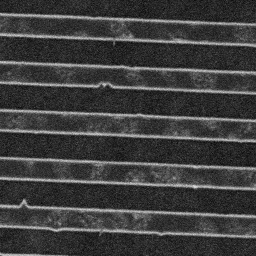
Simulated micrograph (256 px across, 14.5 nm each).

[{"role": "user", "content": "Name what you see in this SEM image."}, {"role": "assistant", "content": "parallel lines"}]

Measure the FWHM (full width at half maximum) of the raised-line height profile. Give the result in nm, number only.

304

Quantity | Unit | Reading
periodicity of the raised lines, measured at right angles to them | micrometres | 0.693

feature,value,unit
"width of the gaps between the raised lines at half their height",26.2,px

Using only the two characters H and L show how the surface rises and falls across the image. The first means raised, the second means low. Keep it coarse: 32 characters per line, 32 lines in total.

LLLLLLLLLLLLLLLLLLLLLLLLLLLLLLLL
LLLLLLLLLLLLLLLLLLLLLLLLLLLLLLLL
HHHHHHHHHHHHHHHHHLLLLLLLLLLLLLLL
HHHHHHHHHHHHHHHHHHHHHHHHHHHHHHHH
LLLLHHHHHHHHHHHHHHHHHHHHHHHHHHHH
LLLLLLLLLLLLLLLLLLLLLLLLLLLLHHHH
LLLLLLLLLLLLLLLLLLLLLLLLLLLLLLLL
LLLLLLLLLLLLLLLLLLLLLLLLLLLLLLLL
HHHHHHHHHHHHHHHHLLLLLLLLLLLLLLLL
HHHHHHHHHHHHHHHHHHHHHHHHHHHHHHHH
LLLLHHHHHHHHHHHHHHHHHHHHHHHHHHHH
LLLLLLLLLLLLLLLLLLLLLLLLLLLLHHHH
LLLLLLLLLLLLLLLLLLLLLLLLLLLLLLLL
LLLLLLLLLLLLLLLLLLLLLLLLLLLLLLLL
HHHHHHHHHHHHHHHHHHHLLLLLLLLLLLLL
HHHHHHHHHHHHHHHHHHHHHHHHHHHHHHHH
LLLLHHHHHHHHHHHHHHHHHHHHHHHHHHHH
LLLLLLLLLLLLLLLLLLLLLLLLLLLHHHHH
LLLLLLLLLLLLLLLLLLLLLLLLLLLLLLLL
LLLLLLLLLLLLLLLLLLLLLLLLLLLLLLLL
HHHHHHHHHHHHHHHHHHHLLLLLLLLLLLLL
HHHHHHHHHHHHHHHHHHHHHHHHHHHHHHHH
LLLLLLHHHHHHHHHHHHHHHHHHHHHHHHHH
LLLLLLLLLLLLLLLLLLLLLLLLLLLHHHHH
LLLLLLLLLLLLLLLLLLLLLLLLLLLLLLLL
LLLLLLLLLLLLLLLLLLLLLLLLLLLLLLLL
HHHHHHHHHHHHHHHHHHLLLLLLLLLLLLLL
HHHHHHHHHHHHHHHHHHHHHHHHHHHHHHHH
LLLLLLHHHHHHHHHHHHHHHHHHHHHHHHHH
LLLLLLLLLLLLLLLLLLLLLLLLLLLLLHHH
LLLLLLLLLLLLLLLLLLLLLLLLLLLLLLLL
LLLLLLLLLLLLLLLLLLLLLLLLLLLLLLLL